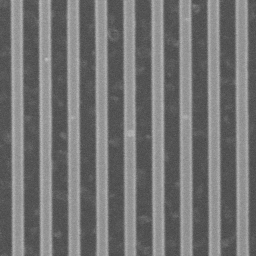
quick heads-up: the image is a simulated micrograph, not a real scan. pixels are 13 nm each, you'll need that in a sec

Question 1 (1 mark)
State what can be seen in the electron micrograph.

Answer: parallel lines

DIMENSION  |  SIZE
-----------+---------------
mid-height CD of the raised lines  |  129 nanometers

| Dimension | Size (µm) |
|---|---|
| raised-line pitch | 0.366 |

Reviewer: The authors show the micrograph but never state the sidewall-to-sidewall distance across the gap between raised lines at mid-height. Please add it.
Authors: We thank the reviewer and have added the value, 236 nm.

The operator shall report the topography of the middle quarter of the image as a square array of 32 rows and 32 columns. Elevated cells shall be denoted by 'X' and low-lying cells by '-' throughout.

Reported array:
-XXX----XX-----XX-----XXX----XXX
-XXX----XX-----XX-----XXX----XXX
-XXX----XX-----XX-----XXX----XXX
-XXX----XX-----XX-----XXX----XXX
-XXX----XXX----XX-----XXX----XXX
-XXX----XXX----XX-----XXX----XXX
-XXX----XXX----XX-----XXX----XXX
-XXX----XXX----XX-----XXX----XXX
-XXX----XXX----XX-----XXX----XXX
-XXX----XXX----XX-----XXX----XXX
-XXX----XXX----XX-----XXX----XXX
-XXX----XXX----XXX----XXX----XXX
-XXX----XXX----XXX----XXX----XXX
-XXX----XXX----XXX----XXX----XXX
-XXX----XXX----XXX----XXX----XXX
-XXX----XXX----XXX----XXX----XXX
-XXX----XXX----XXX----XXX----XXX
-XXX----XXX----XXX----XXX----XXX
-XXX----XXX----XXX----XXX----XXX
-XXX----XXX----XXX----XXX----XXX
-XXX----XXX----XXX----XXX----XXX
-XXX----XXX----XXX----XXX----XXX
-XXX----XXX----XXX----XXX----XXX
-XXX----XXX----XXX----XXX----XXX
-XXX----XXX----XXX----XXX----XXX
-XXX----XXX----XXX----XXX----XXX
-XXX----XXX----XXX----XXX----XXX
-XXX----XXX----XXX----XXX----XXX
-XXX----XXX----XXX----XXX----XXX
-XXX----XXX----XXX----XXX----XXX
-XXX----XXX----XXX----XXX----XXX
-XXX----XXX----XXX----XXX----XXX